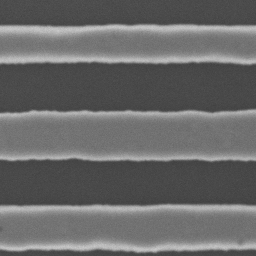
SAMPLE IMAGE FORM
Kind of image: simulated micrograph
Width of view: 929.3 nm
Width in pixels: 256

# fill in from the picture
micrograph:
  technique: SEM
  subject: lines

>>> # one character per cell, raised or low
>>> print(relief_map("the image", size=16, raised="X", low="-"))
----------------
----------------
XXXXXXXXXXXXXXXX
XXXXXXXXXXXXXXXX
----------------
----------------
----------------
XXXXXXXXXXXXXXXX
XXXXXXXXXXXXXXXX
XXXXXXXXXXXXXXXX
----------------
----------------
----------------
XXXXXXXXXXXXXXXX
XXXXXXXXXXXXXXXX
XXXXXXXXXXXXXXXX